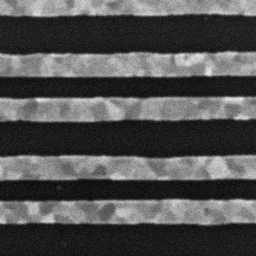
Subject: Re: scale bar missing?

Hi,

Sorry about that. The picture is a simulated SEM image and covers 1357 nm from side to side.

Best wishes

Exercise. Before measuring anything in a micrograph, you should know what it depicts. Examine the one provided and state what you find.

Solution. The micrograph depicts lines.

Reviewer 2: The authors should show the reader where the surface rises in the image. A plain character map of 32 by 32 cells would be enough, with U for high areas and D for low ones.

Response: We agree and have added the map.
UUUUUUUUUUUUUUUUUUUUUUUUUUUUUUUU
UUUUUUUUUUUUUUUUUUUUUUUUUUUUUUUU
DDDDDDDDDDDDDDDDDDDDDDDDDDDDDDDD
DDDDDDDDDDDDDDDDDDDDDDDDDDDDDDDD
DDDDDDDDDDDDDDDDDDDDDDDDDDDDDDDD
DDDDDDDDDDDDDDDDDDDDDDDDDDDDDDDD
DDDDDDDDDDDDDDDDDDDDDDDDDDDDDDDD
UUUUUUUUUUUUUUUUUUUUUUUUUUUUUUUU
UUUUUUUUUUUUUUUUUUUUUUUUUUUUUUUU
DDDDDDDDDDDDDDDDDDDDDDDDDDDDDDDD
DDDDDDDDDDDDDDDDDDDDDDDDDDDDDDDD
DDDDDDDDDDDDDDDDDDDDDDDDDDDDDDDD
UUUUUUUUUUUUUUUUUUUUUUUUUUUUUUUU
UUUUUUUUUUUUUUUUUUUUUUUUUUUUUUUU
UUUUUUUUUUUUUUUUUUUUUUUUUUUUUUUU
DDDDDDDDDDDDDDDDDDDDDDDDDDDDDDDD
DDDDDDDDDDDDDDDDDDDDDDDDDDDDDDDD
DDDDDDDDDDDDDDDDDDDDDDDDDDDDDDDD
DDDDDDDDDDDDDDDDDDDDDDDDDDDDDDDD
DDDDDDDDDDDDDDDDDDDDDDDDDDDDDDDD
UUUUUUUUUUUUUUUUUUUUUUUUUUUUUUUU
UUUUUUUUUUUUUUUUUUUUUUUUUUUUUUUU
DDDDDDDDDDDDDDDDDDDDDDDDDDDDDDDD
DDDDDDDDDDDDDDDDDDDDDDDDDDDDDDDD
DDDDDDDDDDDDDDDDDDDDDDDDDDDDDDDD
UUUUUUUUUUUUUUUUUUUUUUUUUUUUUUUU
UUUUUUUUUUUUUUUUUUUUUUUUUUUUUUUU
UUUUUUUUUUUUUUUUUUUUUUUUUUUUUUUU
DDDDDDDDDDDDDDDDDDDDDDDDDDDDDDDD
DDDDDDDDDDDDDDDDDDDDDDDDDDDDDDDD
DDDDDDDDDDDDDDDDDDDDDDDDDDDDDDDD
DDDDDDDDDDDDDDDDDDDDDDDDDDDDDDDD